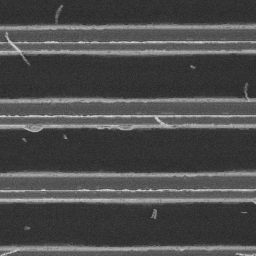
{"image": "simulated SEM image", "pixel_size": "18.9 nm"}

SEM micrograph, lines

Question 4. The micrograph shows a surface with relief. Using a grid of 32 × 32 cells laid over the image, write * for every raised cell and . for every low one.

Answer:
................................
................................
................................
................................
********************************
********************************
................................
................................
................................
................................
................................
................................
................................
********************************
********************************
********************************
................................
................................
................................
................................
................................
................................
********************************
********************************
********************************
................................
................................
................................
................................
................................
................................
********************************